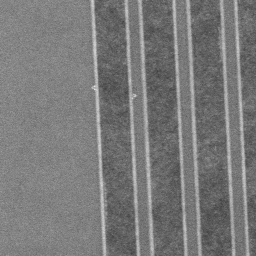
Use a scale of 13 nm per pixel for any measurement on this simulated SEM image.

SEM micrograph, parallel lines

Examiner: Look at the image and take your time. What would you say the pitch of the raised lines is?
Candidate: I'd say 620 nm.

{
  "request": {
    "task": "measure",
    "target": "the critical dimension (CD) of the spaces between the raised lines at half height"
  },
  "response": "187 nanometers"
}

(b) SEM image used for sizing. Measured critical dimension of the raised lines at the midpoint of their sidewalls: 432 nm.